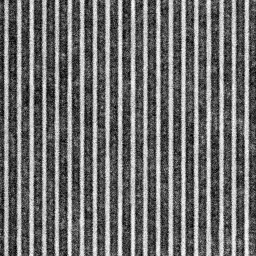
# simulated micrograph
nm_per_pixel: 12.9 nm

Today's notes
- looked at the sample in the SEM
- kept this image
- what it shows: parallel lines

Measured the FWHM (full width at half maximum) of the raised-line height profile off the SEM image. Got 43.5 nm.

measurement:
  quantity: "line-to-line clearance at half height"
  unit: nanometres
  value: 122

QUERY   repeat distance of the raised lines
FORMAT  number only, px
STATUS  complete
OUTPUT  12.6